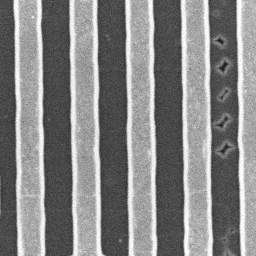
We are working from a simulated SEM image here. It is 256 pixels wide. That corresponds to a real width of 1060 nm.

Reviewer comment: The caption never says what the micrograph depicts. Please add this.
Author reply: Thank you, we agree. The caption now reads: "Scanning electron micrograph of wiring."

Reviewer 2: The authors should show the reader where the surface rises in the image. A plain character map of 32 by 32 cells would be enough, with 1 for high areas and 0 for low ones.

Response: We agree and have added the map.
00111000011100001110000111000011
00111000011100001110000111000011
00111000011100001110000111000011
00111000011100001110000111000011
00111000011100001110000111000011
00111000011100001110000111000011
00111000011100001110000111000011
00111000011100001110000111000011
00111000011100001110000111000011
00111000011100001110000111000011
00111000011100001110000111000011
00111000011100001110000111000011
00111000011100001110000111000011
00111000011100001110000111000011
00111000011100001110000111000011
00111000011100001110000111000011
00111000011100001110000111000011
00111000011100001110000111000011
00111000011100001110000111000011
00111000011100001110000111000011
00111000011100001110000111000011
00111000011100001110000111000011
00111000011100001110000111000011
00111000011100001110000111000011
00111000011100001110000111000011
00111000011100001110000111000011
00111000011100001110000111000011
00111000011100001110000111000011
00111000011100001110000111000011
00111000011100001110000111000011
00011000011100001110000111000011
00011000011100001110000111000011